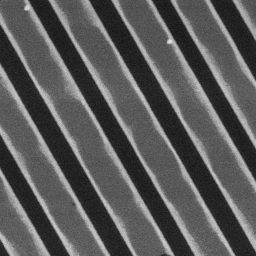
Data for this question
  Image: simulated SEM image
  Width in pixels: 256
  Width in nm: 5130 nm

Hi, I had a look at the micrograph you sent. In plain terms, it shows lines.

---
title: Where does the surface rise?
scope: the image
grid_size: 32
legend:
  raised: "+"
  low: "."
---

++++..+++++...+++++...++++...+++
++++...+++++...+++++..+++++...++
+++++...++++...+++++...+++++...+
+++++...+++++...+++++..+++++...+
.+++++...+++++...++++...+++++...
..+++++..+++++...+++++...++++...
..+++++...+++++...+++++..+++++..
...+++++..+++++...+++++...++++..
...+++++...+++++...+++++..+++++.
+...+++++...++++...+++++...+++++
+...+++++...+++++...+++++..+++++
++...+++++...+++++...++++...++++
++....+++++..+++++...+++++...+++
+++...+++++...+++++...+++++..+++
++++...+++++..+++++...+++++...++
++++...+++++...+++++...+++++..++
+++++...+++++...++++...+++++...+
.++++...+++++...+++++...+++++..+
.+++++...+++++...+++++...++++...
..++++....+++++..+++++...+++++..
..+++++...+++++...+++++...+++++.
...+++++...+++++..+++++...+++++.
+..+++++...+++++...+++++...+++++
+...+++++...+++++...++++...+++++
++..+++++...+++++...+++++...++++
++...+++++...+++++...+++++...+++
+++...+++++...+++++..+++++...+++
++++..+++++...+++++...+++++...++
++++...+++++...+++++...++++...++
+++++..+++++...+++++...+++++...+
+++++...+++++...+++++...+++++...
.+++++...++++...+++++...+++++...